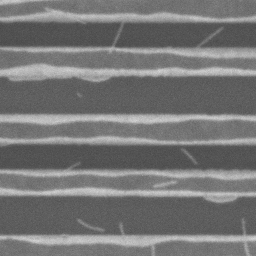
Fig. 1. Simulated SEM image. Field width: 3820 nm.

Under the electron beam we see lines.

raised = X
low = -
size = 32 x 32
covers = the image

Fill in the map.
XXXXXXXXXXXXXXXXXXXXXXXXXXXXXXXX
XXXXXXXXXXXXXXXXXXXXXXXXXXXXXXXX
XX-------XX-------------XXXXXXXX
--------------------------------
--------------------------------
--------------------------------
XXXXXXXXXXXXXXXXXXXXXXXXXXXXXXXX
XXXXXXXXXXXXXXXXXXXXXXXXXXXXXXXX
XXXXXXXXXXXXXXXXXXXXXXXXXXXXXXXX
--------------------------------
--------------------------------
--------------------------------
--------------------------------
--------------------------------
--------------------------------
XXXXXXXXXXXXXXXXXXXXXXXXXXXXXXXX
XXXXXXXXXXXXXXXXXXXXXXXXXXXXXXXX
XXXXXXXXXXXXXXXXXXXXXXXXXXXXXXXX
--------------------------------
--------------------------------
--------------------------------
XXXXX--XXXXXXX-XXXXXX-----------
XXXXXXXXXXXXXXXXXXXXXXXXXXXXXXXX
XXXXXXXXXXXXXXXXXXXXXXXXXXXXXXXX
--------------------------------
--------------------------------
--------------------------------
--------------------------------
--------------------------------
------X-------------------------
XXXXXXXXXXXXXXXXXXXXXXXXXXXXXXXX
XXXXXXXXXXXXXXXXXXXXXXXXXXXXXXXX